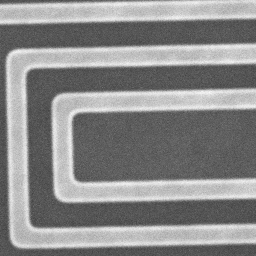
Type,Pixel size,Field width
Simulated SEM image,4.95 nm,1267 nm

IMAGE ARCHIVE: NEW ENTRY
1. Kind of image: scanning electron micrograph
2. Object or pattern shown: groups of lines, slits or small figures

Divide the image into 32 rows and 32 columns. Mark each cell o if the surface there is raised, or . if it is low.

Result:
.........ooooooooooooooooooooooo
oooooooooooooooooooooooooooooooo
oooooooooooooooooooo............
................................
................................
................................
.ooooooooooooooooooooooooooooooo
.ooooooooooooooooooooooooooooooo
.ooo............................
.oo.............................
.oo.............................
.oo.................oooooooooooo
.oo....ooooooooooooooooooooooooo
.oo....ooooooooooooooooooooooo..
.oo....oo.......................
.oo....oo.......................
.oo....oo.......................
.oo....oo.......................
.oo....oo.......................
.oo....oo.......................
.oo....oo.......................
.oo....oo.......................
.oo....oo....................ooo
.oo....ooooooooooooooooooooooooo
.oo....ooooooooooooooooooooooooo
.ooo............................
.ooo............................
.ooo............................
.ooo........oooooooooooooooooooo
.ooooooooooooooooooooooooooooooo
..ooooooooooooooooooooo.........
................................